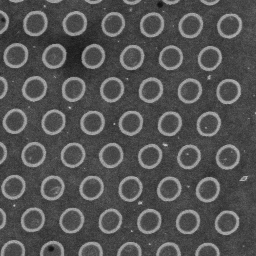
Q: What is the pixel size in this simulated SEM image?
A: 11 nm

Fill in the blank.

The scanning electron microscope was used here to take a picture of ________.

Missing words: a regular array of raised bodies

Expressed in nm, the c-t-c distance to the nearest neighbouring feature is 418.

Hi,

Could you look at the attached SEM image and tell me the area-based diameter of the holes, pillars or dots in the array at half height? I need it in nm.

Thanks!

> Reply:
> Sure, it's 246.